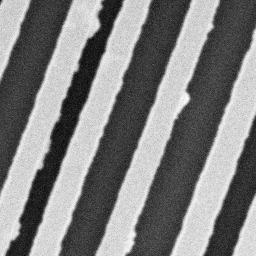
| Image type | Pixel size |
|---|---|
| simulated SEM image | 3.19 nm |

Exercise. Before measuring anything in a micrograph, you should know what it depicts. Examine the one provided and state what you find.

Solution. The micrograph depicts lines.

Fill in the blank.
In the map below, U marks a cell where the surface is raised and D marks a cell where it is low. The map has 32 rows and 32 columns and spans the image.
UUUUDDDDDUUUDDDUUUUDDDDDUUUDDDDD
UUUDDDDDDUUUDDDUUUDDDDDDUUUDDDDD
UUUDDDDDUUUUDDDUUUDDDDDUUUUDDDDD
UUDDDDDDUUUDDDUUUUDDDDDUUUDDDDDD
UUDDDDDDUUUDDDUUUDDDDDUUUUDDDDDD
UUDDDDDUUUUDDUUUUDDDDDUUUDDDDDDD
UDDDDDDUUUDDDUUUDDDDDDUUUDDDDDDU
UDDDDDUUUUDDDUUUDDDDDUUUUDDDDDDU
UDDDDDUUUDDDUUUUDDDDDUUUDDDDDDUU
DDDDDDUUUDDDUUUDDDDDDUUUDDDDDDUU
DDDDDUUUUDDDUUUDDDDDUUUDDDDDDUUU
DDDDDUUUDDDUUUUDDDDDUUUDDDDDDUUU
DDDDDUUUDDDUUUDDDDDDUUUDDDDDDUUU
DDDDUUUUDDUUUUDDDDDUUUDDDDDDUUUU
DDDDUUUDDDUUUUDDDDDUUUDDDDDDUUUU
DDDUUUUDDDUUUDDDDDUUUUDDDDDDUUUD
DDDUUUDDDUUUUDDDDDUUUDDDDDDUUUUD
DDDUUUDDDUUUDDDDDUUUUDDDDDDUUUUD
DDUUUUDDDUUUDDDDDUUUUDDDDDDUUUDD
DDUUUDDDUUUUDDDDDUUUDDDDDDUUUUDD
DDUUUDDDUUUDDDDDUUUUDDDDDDUUUUDD
DUUUUDDDUUUDDDDDUUUDDDDDDUUUUDDD
DUUUDDDUUUDDDDDDUUUDDDDDDUUUUDDD
UUUUDDDUUUDDDDDUUUUDDDDDUUUUUDDD
UUUDDDUUUUDDDDDUUUDDDDDDUUUUDDDD
UUUDDDUUUDDDDDDUUUDDDDDDUUUUDDDD
UUUDDDUUUDDDDDUUUUDDDDDUUUUDDDDU
UUDDDUUUUDDDDDUUUDDDDDDUUUUDDDDU
UUDDDUUUDDDDDUUUUDDDDDDUUUUDDDUU
UDDDDUUUDDDDDUUUDDDDDDUUUUDDDDUU
UDDDUUUUDDDDDUUUDDDDDDUUUUDDDDUU
UDDDUUUDDDDDUUUUDDDDDDUUUUDDDUUU